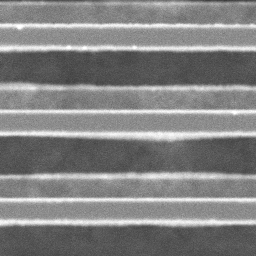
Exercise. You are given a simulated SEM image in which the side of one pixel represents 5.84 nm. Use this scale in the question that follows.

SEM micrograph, lines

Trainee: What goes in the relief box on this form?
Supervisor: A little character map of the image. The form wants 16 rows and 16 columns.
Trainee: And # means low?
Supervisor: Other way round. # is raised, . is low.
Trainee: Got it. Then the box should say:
################
################
################
................
................
..#.............
################
################
................
................
................
################
################
################
................
................